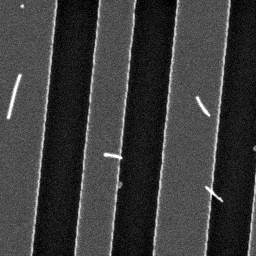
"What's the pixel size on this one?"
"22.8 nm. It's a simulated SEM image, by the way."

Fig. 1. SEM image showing lines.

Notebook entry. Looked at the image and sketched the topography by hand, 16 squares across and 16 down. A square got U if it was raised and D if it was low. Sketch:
UUUUDDUUDDDUUUDD
UUUDDDUUDDDUUUDD
UUUDDDUUDDDUUUDD
UUUDDDUUDDDUUUDD
UUUDDDUUDDDUUUDD
UUUDDDUUDDDUUUDD
UUUDDDUUDDUUUUDD
UUUDDDUUDDUUUUDD
UUUDDUUUDDUUUUDD
UUUDDUUUDDUUUDDD
UUUDDUUDDDUUUDDD
UUDDDUUDDDUUUDDD
UUDDDUUDDDUUUDDD
UUDDDUUDDDUUUDDD
UUDDDUUDDDUUUDDD
UUDDDUUDDDUUUDDD